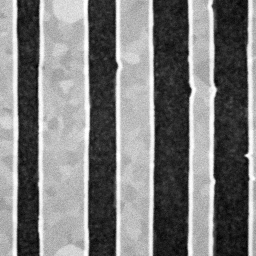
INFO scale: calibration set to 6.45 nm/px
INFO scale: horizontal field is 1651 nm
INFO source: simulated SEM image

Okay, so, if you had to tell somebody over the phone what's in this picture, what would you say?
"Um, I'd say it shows one or a few lines or trenches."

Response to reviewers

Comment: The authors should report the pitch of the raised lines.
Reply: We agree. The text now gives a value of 445 nanometres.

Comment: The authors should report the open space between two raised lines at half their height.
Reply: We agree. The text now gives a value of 221 nanometres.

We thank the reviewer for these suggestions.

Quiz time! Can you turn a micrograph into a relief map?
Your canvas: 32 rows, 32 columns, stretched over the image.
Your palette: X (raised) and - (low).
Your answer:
XX---XXXXXX----XXXX-----XX-----X
XX---XXXXXX----XXXX-----XX-----X
XX---XXXXXX----XXXX-----XX-----X
XX---XXXXXX----XXXX-----XX-----X
XX---XXXXXX----XXXX-----XXX----X
XX---XXXXXX----XXXX-----XXX----X
XX---XXXXXX----XXXX-----XXX----X
XX---XXXXXX----XXXX-----XXX----X
XX---XXXXXX----XXXX-----XXX----X
XX---XXXXXX----XXXX-----XXX----X
XX---XXXXXX----XXXX-----XXX----X
XX---XXXXXX----XXXX-----XXX----X
XX---XXXXXX----XXXX-----XXX----X
XX---XXXXXX----XXXX-----XXX----X
XX---XXXXXX----XXXX-----XXX----X
XX---XXXXXX----XXXX-----XXX----X
XX---XXXXXX----XXXX-----XXX----X
XX---XXXXXX----XXXX-----XXX----X
XX---XXXXXX----XXXX-----XXX----X
XX---XXXXXX----XXXX-----XX-----X
XX---XXXXXX----XXXX-----XX-----X
XX---XXXXXX----XXXX-----XX-----X
XX---XXXXXX----XXXX-----XXX----X
XX---XXXXXX----XXXX-----XXX----X
XX---XXXXXX----XXXX-----XXX----X
XX---XXXXXX----XXXX-----XXX----X
XX---XXXXXX----XXXX-----XX-----X
XX---XXXXXX----XXXX-----XX-----X
XX---XXXXXX----XXXX-----XX-----X
XX---XXXXXX----XXXX-----XX-----X
XX---XXXXXX----XXXX-----XX-----X
XX---XXXXXX----XXXX-----XX-----X